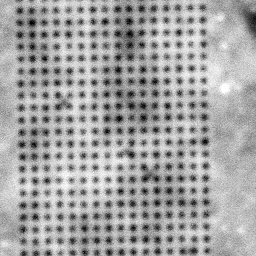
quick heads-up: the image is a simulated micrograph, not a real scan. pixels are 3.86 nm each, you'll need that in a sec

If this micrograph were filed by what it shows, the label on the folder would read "a regular array of holes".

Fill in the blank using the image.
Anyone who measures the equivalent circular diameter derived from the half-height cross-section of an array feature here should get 21.8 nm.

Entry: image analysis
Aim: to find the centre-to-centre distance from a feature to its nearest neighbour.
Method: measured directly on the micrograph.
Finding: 0.0459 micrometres